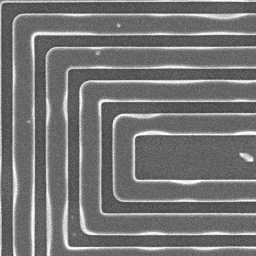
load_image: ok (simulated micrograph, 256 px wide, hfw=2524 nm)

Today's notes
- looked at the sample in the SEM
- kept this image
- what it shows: groups of lines, slits or small figures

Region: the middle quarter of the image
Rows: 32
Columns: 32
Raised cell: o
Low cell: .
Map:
oooooooooooooooooooooooooooooooo
o...............................
o...............................
o...............................
o.....ooooooooooooooooooo.....oo
o...oooooooooooooooooooooooooooo
o...oooooooooooooooooooooooooooo
o...oooooooooooooooooooooooooooo
....oooooooooooooooooooooooooooo
....ooooo.......................
....ooooo.......................
....ooooo.......................
....ooooo...............oooooooo
o...ooooo....ooooooooooooooooooo
o...ooooo....ooooooooooooooooooo
o...ooooo...oooooooooooooooooooo
o...ooooo...oooooooooooooooooooo
o...ooooo...ooooooo.......oooooo
o...ooooo...oooooo..............
o...ooooo...oooooo..............
o...ooooo...oooooo..............
o...ooooo...oooooo..............
o...ooooo...oooooo..............
o...ooooo...oooooo..............
o...ooooo...oooooo..............
o...ooooo...oooooo..............
o...ooooo...oooooo..............
o...ooooo...oooooo..............
o...ooooo...oooooo..............
o...ooooo...oooooooooooooooooo..
o...ooooo...oooooooooooooooooooo
o...ooooo...oooooooooooooooooooo